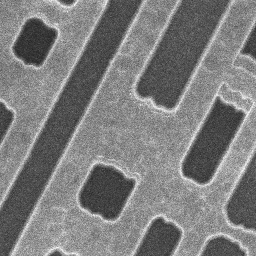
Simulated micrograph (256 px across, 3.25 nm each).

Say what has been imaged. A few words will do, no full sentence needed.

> one or a few lines or trenches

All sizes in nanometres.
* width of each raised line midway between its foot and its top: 108